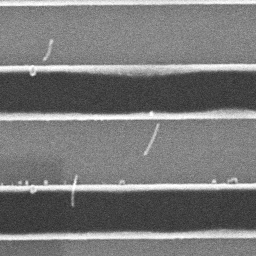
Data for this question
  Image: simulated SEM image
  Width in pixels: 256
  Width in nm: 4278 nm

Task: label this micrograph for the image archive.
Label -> lines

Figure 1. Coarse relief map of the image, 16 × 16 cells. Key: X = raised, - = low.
----------------
----------------
----------------
----------------
XXXXXXXXXXXXXXXX
XXXXXXXXXXXXXXXX
XXXXXXXXXXXXXXXX
----------------
----------------
----------------
----------------
----------------
XXXXXXXXXXXXXXXX
XXXXXXXXXXXXXXXX
XXXXXXXXXXXXXXXX
----------------